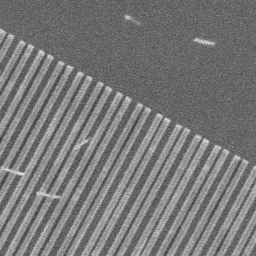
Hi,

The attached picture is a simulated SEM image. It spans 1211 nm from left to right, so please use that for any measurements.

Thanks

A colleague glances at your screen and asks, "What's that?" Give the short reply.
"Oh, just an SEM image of parallel lines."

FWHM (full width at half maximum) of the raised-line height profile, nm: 27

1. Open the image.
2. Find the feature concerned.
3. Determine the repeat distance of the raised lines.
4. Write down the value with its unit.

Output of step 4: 11 px